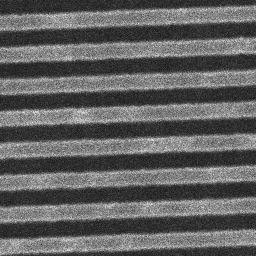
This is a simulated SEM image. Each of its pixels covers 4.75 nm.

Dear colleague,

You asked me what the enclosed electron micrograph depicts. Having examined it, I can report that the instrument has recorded parallel lines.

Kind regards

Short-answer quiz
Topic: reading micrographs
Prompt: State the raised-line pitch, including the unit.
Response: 152 nanometres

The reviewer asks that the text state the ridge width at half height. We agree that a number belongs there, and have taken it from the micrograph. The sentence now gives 80 nanometres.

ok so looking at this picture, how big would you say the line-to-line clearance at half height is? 71.7 nanometres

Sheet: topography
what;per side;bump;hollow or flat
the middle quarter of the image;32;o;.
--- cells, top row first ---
................................
................................
.................ooooooooooooooo
oooooooooooooooooooooooooooooooo
oooooooooooooooooooooooooooooooo
oooooooooooooooooooooooooooooooo
ooooooooooooooooo.oooo..........
................................
................................
................................
..............o.oooooooooooooooo
oooooooooooooooooooooooooooooooo
oooooooooooooooooooooooooooooooo
oooooooooooooooooooooooooooooooo
ooooooooooooooooo...oo..........
................................
................................
................................
.................ooooooooooooooo
oooooooooooooooooooooooooooooooo
oooooooooooooooooooooooooooooooo
oooooooooooooooooooooooooooooooo
oooooooooooooooooooo............
................................
................................
................................
..................oooooooooooooo
oooooooooooooooooooooooooooooooo
oooooooooooooooooooooooooooooooo
oooooooooooooooooooooooooooooooo
ooooooooooooooooo..o............
................................